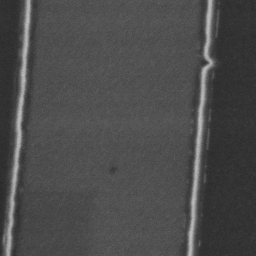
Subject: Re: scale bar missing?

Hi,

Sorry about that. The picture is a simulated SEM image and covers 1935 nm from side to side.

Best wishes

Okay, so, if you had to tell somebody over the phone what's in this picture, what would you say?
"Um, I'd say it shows one or a few lines or trenches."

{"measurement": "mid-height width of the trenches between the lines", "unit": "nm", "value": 1360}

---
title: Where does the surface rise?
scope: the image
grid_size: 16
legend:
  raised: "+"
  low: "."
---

++...........+++
++...........+++
++...........+++
++...........+++
+............+++
+............+++
+............+++
+............+++
+...........++++
+...........++++
+...........++++
+...........++++
+...........++++
+...........++++
+...........++++
+...........++++